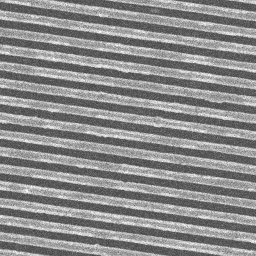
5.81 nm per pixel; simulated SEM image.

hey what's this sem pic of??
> parallel lines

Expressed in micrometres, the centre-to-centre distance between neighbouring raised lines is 0.0982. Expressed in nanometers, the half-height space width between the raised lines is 52.6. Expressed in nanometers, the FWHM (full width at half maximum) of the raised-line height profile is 47.5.